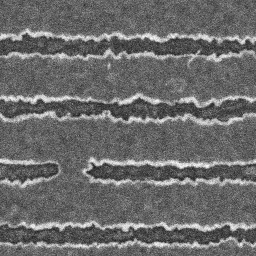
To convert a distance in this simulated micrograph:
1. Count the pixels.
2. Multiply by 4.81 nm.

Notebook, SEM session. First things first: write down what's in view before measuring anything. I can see one or a few lines or trenches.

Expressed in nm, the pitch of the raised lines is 303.